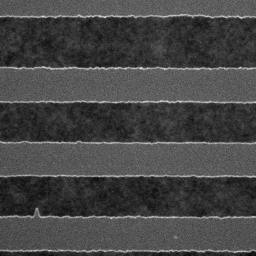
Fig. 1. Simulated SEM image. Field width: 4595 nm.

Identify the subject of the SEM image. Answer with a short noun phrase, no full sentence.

one or a few lines or trenches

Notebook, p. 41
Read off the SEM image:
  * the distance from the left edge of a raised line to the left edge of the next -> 74.4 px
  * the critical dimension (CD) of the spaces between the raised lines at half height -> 0.738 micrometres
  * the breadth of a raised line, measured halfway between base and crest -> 606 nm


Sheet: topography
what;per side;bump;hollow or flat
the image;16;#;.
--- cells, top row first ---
################
................
................
................
################
################
................
................
................
################
################
................
................
..#.............
################
################